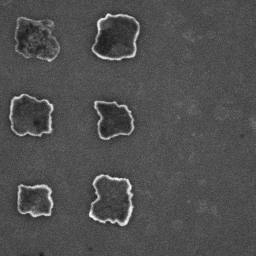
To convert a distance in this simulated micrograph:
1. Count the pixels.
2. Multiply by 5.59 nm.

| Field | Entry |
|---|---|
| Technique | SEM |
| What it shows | raised bodies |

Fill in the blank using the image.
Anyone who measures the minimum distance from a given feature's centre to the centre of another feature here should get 448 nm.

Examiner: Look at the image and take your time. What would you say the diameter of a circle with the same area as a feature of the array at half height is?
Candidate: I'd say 42.7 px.